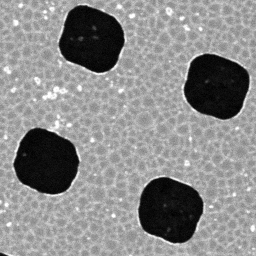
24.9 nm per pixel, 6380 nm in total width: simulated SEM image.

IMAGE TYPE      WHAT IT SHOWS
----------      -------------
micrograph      holes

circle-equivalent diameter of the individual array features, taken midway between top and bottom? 1.63 µm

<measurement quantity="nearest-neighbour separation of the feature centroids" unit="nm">3280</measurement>